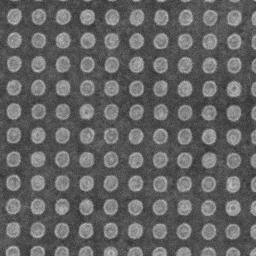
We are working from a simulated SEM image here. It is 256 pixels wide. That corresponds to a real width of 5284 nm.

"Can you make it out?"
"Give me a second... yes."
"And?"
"a regular array of raised bodies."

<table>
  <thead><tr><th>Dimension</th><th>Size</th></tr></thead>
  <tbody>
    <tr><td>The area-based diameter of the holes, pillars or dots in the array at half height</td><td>280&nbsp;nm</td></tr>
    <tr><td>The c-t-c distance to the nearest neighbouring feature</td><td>486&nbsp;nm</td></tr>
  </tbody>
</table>